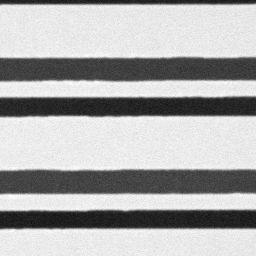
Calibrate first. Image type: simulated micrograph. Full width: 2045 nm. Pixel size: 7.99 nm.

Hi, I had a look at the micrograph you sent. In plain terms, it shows lines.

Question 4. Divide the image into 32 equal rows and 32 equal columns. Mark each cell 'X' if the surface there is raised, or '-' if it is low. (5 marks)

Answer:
--------------------------------
XXXXXXXXXXXXXXXXXXXXXXXXXXXXXXXX
XXXXXXXXXXXXXXXXXXXXXXXXXXXXXXXX
XXXXXXXXXXXXXXXXXXXXXXXXXXXXXXXX
XXXXXXXXXXXXXXXXXXXXXXXXXXXXXXXX
XXXXXXXXXXXXXXXXXXXXXXXXXXXXXXXX
XXXXXXXXXXXXXXXXXXXXXXXXXXXXXXXX
--------------------------------
--------------------------------
--------------------------------
XXXXXXXXXXXXXXXXXXXXXXXXXXXXXXXX
XXXXXXXXXXXXXXXXXXXXXXXXXXXXXXXX
--------------------------------
--------------------------------
--------------------------------
XXXXXXXXXXXXXXXXXXXXXXXXXXXXXXXX
XXXXXXXXXXXXXXXXXXXXXXXXXXXXXXXX
XXXXXXXXXXXXXXXXXXXXXXXXXXXXXXXX
XXXXXXXXXXXXXXXXXXXXXXXXXXXXXXXX
XXXXXXXXXXXXXXXXXXXXXXXXXXXXXXXX
XXXXXXXXXXXXXXXXXXXXXXXXXXXXXXXX
--------------------------------
--------------------------------
--------------------------------
XXXXXXXXXXXXXXXXXXXXXXXXXXXXXXXX
XXXXXXXXXXXXXXXXXXXXXXXXXXXXXXXX
--------------------------------
--------------------------------
--------------------------------
XXXXXXXXXXXXXXXXXXXXXXXXXXXXXXXX
XXXXXXXXXXXXXXXXXXXXXXXXXXXXXXXX
XXXXXXXXXXXXXXXXXXXXXXXXXXXXXXXX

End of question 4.